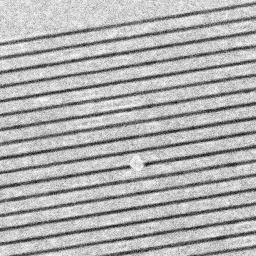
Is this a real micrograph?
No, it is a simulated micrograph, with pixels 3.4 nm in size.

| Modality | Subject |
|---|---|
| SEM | parallel lines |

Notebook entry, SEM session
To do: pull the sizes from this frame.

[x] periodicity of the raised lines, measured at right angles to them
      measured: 48 nanometers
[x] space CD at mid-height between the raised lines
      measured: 0.0121 µm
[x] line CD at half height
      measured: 0.0361 um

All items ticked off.